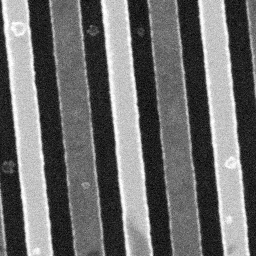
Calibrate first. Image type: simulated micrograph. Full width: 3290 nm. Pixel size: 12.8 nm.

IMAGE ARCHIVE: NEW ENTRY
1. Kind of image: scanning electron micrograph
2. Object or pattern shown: lines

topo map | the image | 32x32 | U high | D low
UUUDDDUUUUDDDUUUDDUUUUDDDUUUDDDU
UUUUDDUUUUDDDUUUDDDUUUDDDUUUDDDU
DUUUDDUUUUDDDUUUDDDUUUDDDUUUDDDU
DUUUDDDUUUDDDUUUDDDUUUDDDUUUDDDU
DUUUDDDUUUDDDUUUDDDUUUDDDUUUDDDU
DUUUDDDUUUDDDUUUDDDUUUUDDUUUDDDU
DUUUDDDUUUUDDUUUDDDUUUUDDUUUUDDU
DUUUDDDUUUUDDUUUUDDUUUUDDDUUUDDD
DUUUDDDUUUUDDDUUUDDUUUUDDDUUUDDD
DUUUDDDUUUUDDDUUUDDUUUUDDDUUUDDD
DUUUDDDUUUUDDDUUUDDDUUUDDDUUUDDD
DUUUUDDUUUUDDDUUUDDDUUUDDDUUUDDD
DDUUUDDUUUUDDDUUUDDDUUUDDDUUUDDD
DDUUUDDDUUUDDDUUUDDDUUUDDDUUUDDD
DDUUUDDDUUUDDDUUUDDDUUUUDDUUUDDD
DDUUUDDDUUUDDDUUUDDDUUUUDDUUUUDD
DDUUUDDDUUUUDDUUUDDDUUUUDDUUUUDD
DDUUUDDDUUUUDDDUUUDDUUUUDDDUUUDD
DDUUUDDDUUUUDDDUUUDDUUUUDDDUUUDD
DDUUUDDDUUUUDDDUUUDDUUUUDDDUUUDD
DDUUUDDDUUUUDDDUUUDDDUUUDDDUUUDD
DDUUUDDDUUUUDDDUUUDDDUUUDDDUUUDD
DDUUUUDDUUUUDDDUUUDDDUUUDDDUUUDD
DDDUUUDDDUUUDDDUUUDDDUUUDDDUUUDD
DDDUUUDDDUUUDDDUUUDDDUUUDDDUUUDD
DDDUUUDDDUUUDDDUUUDDDUUUUDDUUUUD
DDDUUUDDDUUUDDDUUUDDDUUUUDDUUUUD
DDDUUUDDDUUUUDDUUUUDDUUUUDDDUUUD
DDDUUUDDDUUUUDDUUUUDDUUUUDDDUUUD
UDDUUUDDDUUUUDDDUUUDDUUUUDDDUUUD
UDDUUUDDDUUUUDDDUUUDDDUUUDDDUUUD
UDDUUUUDDUUUUDDDUUUDDDUUUDDDUUUD